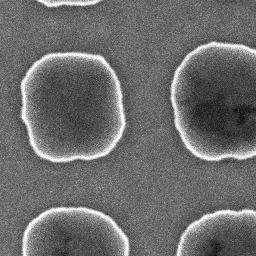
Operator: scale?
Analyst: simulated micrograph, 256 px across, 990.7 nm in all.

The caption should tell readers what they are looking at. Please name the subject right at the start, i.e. raised bodies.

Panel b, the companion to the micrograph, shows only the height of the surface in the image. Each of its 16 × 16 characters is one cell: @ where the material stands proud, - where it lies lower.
----------------
----------------
----------------
---@@@------@@@@
--@@@@@----@@@@@
-@@@@@@----@@@@@
-@@@@@@@---@@@@@
--@@@@@@---@@@@@
--@@@@@----@@@@@
--@@@@@-----@@@@
----------------
----------------
----------------
---@@@@------@@@
--@@@@@@----@@@@
-@@@@@@@---@@@@@